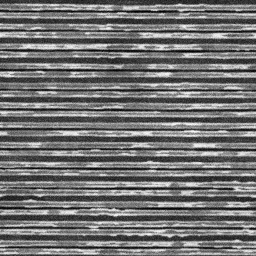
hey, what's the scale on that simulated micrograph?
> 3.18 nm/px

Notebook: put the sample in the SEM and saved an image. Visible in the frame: parallel lines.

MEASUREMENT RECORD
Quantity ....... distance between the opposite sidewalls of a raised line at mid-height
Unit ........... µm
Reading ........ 0.0167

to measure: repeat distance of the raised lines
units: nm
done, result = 31.1